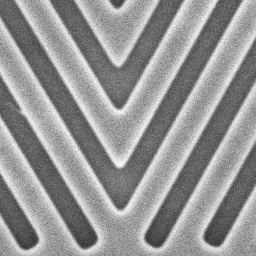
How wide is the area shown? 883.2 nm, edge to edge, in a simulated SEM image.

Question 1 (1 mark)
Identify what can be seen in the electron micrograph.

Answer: groups of lines, slits or small figures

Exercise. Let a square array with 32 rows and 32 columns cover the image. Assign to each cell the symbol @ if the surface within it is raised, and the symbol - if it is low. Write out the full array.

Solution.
--@@@@----@@@@--@@@@---@@@@---@@
---@@@@---@@@@@@@@@---@@@@----@@
---@@@@@---@@@@@@@----@@@@---@@@
@---@@@@---@@@@@@@---@@@@---@@@@
@----@@@@---@@@@@----@@@@---@@@@
@@---@@@@----@@@@---@@@@---@@@@-
@@----@@@@---@@@---@@@@@---@@@@-
@@@---@@@@@---@@---@@@@---@@@@--
@@@@---@@@@-------@@@@----@@@@--
@@@@----@@@@------@@@@---@@@@---
-@@@@---@@@@-----@@@@----@@@@---
-@@@@@---@@@@----@@@@---@@@@---@
--@@@@---@@@@@--@@@@---@@@@----@
---@@@@---@@@@-@@@@@---@@@@---@@
---@@@@----@@@@@@@@---@@@@----@@
@---@@@@---@@@@@@@----@@@@---@@@
@---@@@@@---@@@@@@---@@@@---@@@@
@@---@@@@---@@@@@----@@@@---@@@@
@@----@@@@---@@@@---@@@@---@@@@-
@@@---@@@@----@@---@@@@@---@@@@-
@@@@---@@@@---@@---@@@@---@@@@--
@@@@----@@@@------@@@@----@@@@--
-@@@@---@@@@------@@@@---@@@@---
-@@@@----@@@@----@@@@----@@@@---
--@@@@---@@@@----@@@@---@@@@---@
--@@@@@---@@@@--@@@@---@@@@----@
---@@@@---@@@@@@@@@@---@@@@---@@
----@@@@---@@@@@@@@---@@@@----@@
@---@@@@----@@@@@@----@@@@---@@@
@@---@@@@---@@@@@@---@@@@---@@@@
@@---@@@@@--@@@@@@--@@@@@@--@@@@
@@@@@@@@@@@@@@@@@@@@@@@@@@@@@@@@